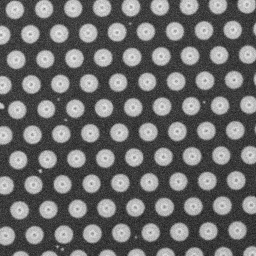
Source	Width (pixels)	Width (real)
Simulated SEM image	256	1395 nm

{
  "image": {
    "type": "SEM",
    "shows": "an array of small figures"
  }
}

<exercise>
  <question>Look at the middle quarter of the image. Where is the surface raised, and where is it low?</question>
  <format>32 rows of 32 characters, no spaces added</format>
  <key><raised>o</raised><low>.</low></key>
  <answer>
.ooo.....oo.....oo..............
................................
.............o......oo.....oo...
o...oooo....ooo....oooo...oooo..
o...oooo...ooooo...oooo...oooo..
o...oooo...ooooo...oooo...oooo..
o....ooo....ooo.....oo.....oo...
................................
........................o......o
.ooo....oooo....ooo....ooo....oo
.oooo...oooo...oooo...ooooo...oo
.oooo...oooo...oooo...ooooo...oo
.oooo...oooo....ooo....ooo.....o
................................
................................
.....ooo....ooo....oooo....ooo..
o....oooo...oooo...oooo...oooo..
o...ooooo...oooo...oooo...oooo..
o....ooo....oooo...oooo....ooo..
................................
................................
..........o.....ooo....ooo....oo
.oooo...oooo....oooo...oooo...oo
.oooo...oooo...ooooo...oooo...oo
.oooo...oooo....ooo....oooo...oo
..oo.....ooo.....o..............
................................
.....................o......oo..
o....oooo...oooo...oooo....oooo.
oo...oooo...oooo...oooo...ooooo.
oo...oooo...oooo...oooo....ooo..
o....ooo.....ooo....oo......o...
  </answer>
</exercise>